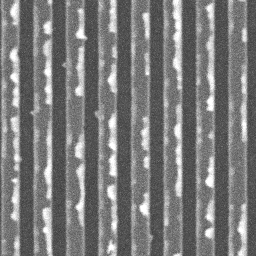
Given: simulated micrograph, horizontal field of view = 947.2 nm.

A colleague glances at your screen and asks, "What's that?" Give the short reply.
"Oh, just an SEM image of parallel lines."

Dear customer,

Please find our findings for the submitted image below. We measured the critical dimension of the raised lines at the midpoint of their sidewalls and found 64.7 nanometres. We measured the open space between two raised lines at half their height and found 54.5 nm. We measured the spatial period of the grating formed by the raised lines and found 120 nanometres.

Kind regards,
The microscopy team